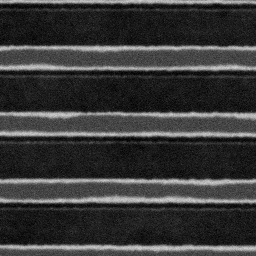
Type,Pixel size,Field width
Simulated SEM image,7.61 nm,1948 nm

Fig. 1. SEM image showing lines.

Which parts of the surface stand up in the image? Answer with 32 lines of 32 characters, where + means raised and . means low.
................................
................................
................................
................................
................................
................................
++++++++++++++++++++++++++++++++
++++++++++++++++++++++++++++++++
++++++++++++++++++++++++++++++++
................................
................................
................................
................................
................................
++++++++++++++++++++++++++++++++
++++++++++++++++++++++++++++++++
++++++++++++++++++++++++++++++++
................................
................................
................................
................................
................................
..+++++++++++++.+...............
++++++++++++++++++++++++++++++++
++++++++++++++++++++++++++++++++
................................
................................
................................
................................
................................
................................
++++++++++++++++++++++++++++++++